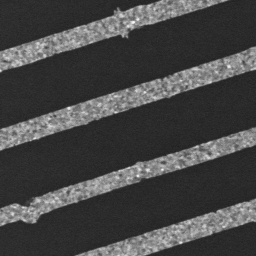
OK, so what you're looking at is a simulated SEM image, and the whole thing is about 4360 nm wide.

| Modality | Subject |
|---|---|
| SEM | one or a few lines or trenches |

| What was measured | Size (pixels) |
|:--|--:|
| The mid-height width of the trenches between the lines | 54.7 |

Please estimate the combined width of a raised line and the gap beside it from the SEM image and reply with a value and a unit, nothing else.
73.4 px